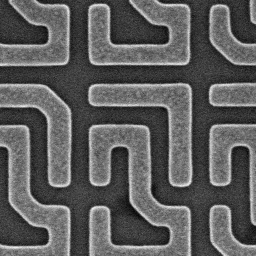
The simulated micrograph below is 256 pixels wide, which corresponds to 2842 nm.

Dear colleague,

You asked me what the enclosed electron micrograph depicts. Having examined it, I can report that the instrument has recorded wiring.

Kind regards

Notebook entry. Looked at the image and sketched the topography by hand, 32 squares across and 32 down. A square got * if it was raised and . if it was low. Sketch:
.****...........****...........*
..*******..***...*******..***..*
...******..***.....*****..***..*
......***..***.......***..***...
......***..***.......***..***...
......***..***.......***...****.
*********..*************....****
*********..*************....****
................................
................................
......................*......***
*******....*************..******
********...*************..******
....*****............***........
......***............***........
......***............***........
****..***..********..***..******
****..***..********..***..******
.***..***..***..***..***..***..*
.***..***..***..***..***..***..*
.***..***..***..***..***..***..*
.***..***..***..***..***..***..*
.***..***..***..***..***..***..*
.***............***............*
.***............***............*
.****...........****...........*
..*******..***...*******..***..*
...******..***....******..***..*
......***..***.......***..***...
......***..***.......***..***...
......***..***.......***...***..
*********..*************....****